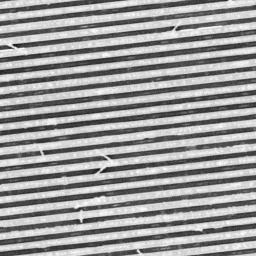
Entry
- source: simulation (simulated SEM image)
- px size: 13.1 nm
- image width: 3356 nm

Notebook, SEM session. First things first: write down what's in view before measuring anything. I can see parallel lines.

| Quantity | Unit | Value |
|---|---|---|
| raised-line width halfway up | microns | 0.0847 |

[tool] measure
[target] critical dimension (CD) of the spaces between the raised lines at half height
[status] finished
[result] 71.6 nm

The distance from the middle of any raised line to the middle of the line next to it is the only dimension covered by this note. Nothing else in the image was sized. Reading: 158 nm